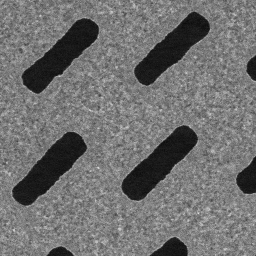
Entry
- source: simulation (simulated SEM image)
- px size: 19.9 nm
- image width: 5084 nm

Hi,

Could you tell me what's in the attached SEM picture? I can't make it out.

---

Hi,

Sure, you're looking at holes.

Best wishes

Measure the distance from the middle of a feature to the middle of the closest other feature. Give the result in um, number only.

2.19